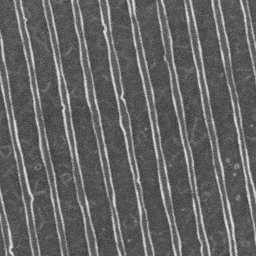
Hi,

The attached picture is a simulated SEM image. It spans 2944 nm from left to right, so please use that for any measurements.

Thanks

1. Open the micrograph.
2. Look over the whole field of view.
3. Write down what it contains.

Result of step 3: parallel lines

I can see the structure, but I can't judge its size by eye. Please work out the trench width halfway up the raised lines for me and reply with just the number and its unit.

239 nm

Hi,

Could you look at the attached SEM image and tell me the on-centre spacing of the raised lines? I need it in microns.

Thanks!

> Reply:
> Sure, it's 0.319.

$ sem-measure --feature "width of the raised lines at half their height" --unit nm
73.6